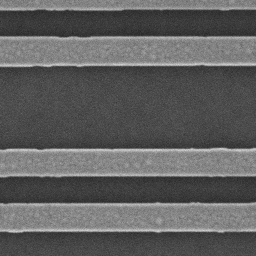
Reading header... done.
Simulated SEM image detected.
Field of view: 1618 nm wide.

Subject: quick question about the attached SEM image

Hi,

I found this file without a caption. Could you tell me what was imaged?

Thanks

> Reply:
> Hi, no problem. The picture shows lines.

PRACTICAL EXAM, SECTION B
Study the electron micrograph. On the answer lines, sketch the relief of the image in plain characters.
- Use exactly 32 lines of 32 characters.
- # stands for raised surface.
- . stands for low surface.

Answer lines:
################################
................................
................................
................................
................................
################################
################################
################################
................................
................................
................................
................................
................................
................................
................................
................................
................................
................................
................................
################################
################################
################################
................................
................................
................................
###.####..####.#.###############
################################
################################
################################
................................
................................
................................